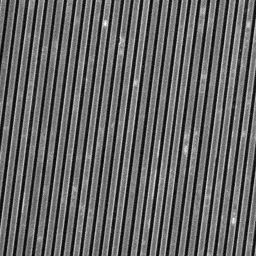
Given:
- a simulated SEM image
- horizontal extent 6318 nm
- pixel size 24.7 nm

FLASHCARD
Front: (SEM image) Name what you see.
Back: parallel lines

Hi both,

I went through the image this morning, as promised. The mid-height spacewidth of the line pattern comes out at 88.7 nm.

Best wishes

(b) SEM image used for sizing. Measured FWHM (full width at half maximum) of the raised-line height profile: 132 nm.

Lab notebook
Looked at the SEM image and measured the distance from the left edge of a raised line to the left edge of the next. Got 0.234 microns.